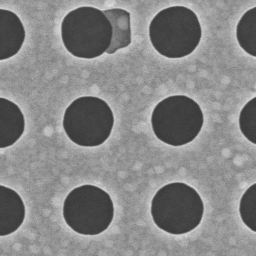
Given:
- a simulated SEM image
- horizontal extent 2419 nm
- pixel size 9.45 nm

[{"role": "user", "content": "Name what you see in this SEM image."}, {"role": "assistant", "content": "holes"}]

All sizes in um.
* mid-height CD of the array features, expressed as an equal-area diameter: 0.493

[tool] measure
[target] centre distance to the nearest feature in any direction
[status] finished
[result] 834 nm